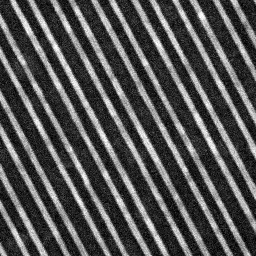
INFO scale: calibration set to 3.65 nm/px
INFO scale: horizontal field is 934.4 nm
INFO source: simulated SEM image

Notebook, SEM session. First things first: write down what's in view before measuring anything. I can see parallel lines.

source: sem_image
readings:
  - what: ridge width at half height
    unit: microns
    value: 0.0158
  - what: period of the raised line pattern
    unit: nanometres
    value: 65.4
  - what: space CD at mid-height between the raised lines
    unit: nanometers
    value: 44.8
